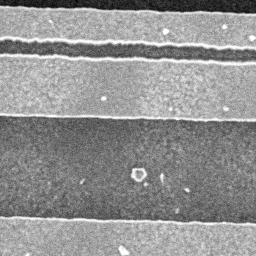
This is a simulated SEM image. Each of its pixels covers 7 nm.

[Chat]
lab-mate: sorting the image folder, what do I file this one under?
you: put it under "lines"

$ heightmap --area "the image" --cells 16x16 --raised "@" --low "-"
@@--------------
@@@@@@@@@@@@@@@@
@@@@@@@@@@@@@@@@
@@@@@@@@@@@@@@@@
@@@@@@@@@@@@@@@@
@@@@@@@@@@@@@@@@
@@@@@@@@@@@@@@@@
----------------
----------------
----------------
----------------
----------------
----------------
----------------
@@@@@@@@@@@@@@@@
@@@@@@@@@@@@@@@@